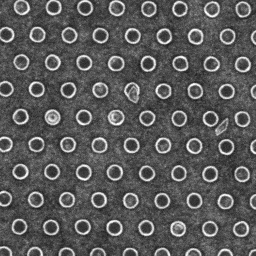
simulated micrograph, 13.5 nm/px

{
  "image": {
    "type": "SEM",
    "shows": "a regular array of raised bodies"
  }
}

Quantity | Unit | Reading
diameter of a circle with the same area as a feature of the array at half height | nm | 197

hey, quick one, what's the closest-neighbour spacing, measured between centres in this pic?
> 421 nm